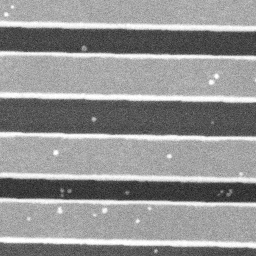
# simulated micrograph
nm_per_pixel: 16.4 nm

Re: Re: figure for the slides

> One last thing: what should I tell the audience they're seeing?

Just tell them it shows lines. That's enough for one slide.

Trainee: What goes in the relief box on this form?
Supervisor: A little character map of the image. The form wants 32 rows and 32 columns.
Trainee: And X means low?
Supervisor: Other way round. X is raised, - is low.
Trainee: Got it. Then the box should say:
XXXXXXXXXXXXXXXXXXXXXXXXXXXXXXXX
XXXXXXXXXXXXXXXXXXXXXXXXXXXXXXXX
XXXXXXXXXXXXXXXXXXXXXXXXXXXXXXXX
----------------------XXXXXXXXXX
--------------------------------
--------------------------------
--------------------------------
XXXXXXXXXXXXXXXXXXXXXXXXXXXXXXXX
XXXXXXXXXXXXXXXXXXXXXXXXXXXXXXXX
XXXXXXXXXXXXXXXXXXXXXXXXXXXXXXXX
XXXXXXXXXXXXXXXXXXXXXXXXXXXXXXXX
XXXXXXXXXXXXXXXXXXXXXXXXXXXXXXXX
-----------------------------XXX
--------------------------------
--------------------------------
--------------------------------
--------------------------------
XXXXXXXXXXXXXXXXXXXXXXXXXXXXXXXX
XXXXXXXXXXXXXXXXXXXXXXXXXXXXXXXX
XXXXXXXXXXXXXXXXXXXXXXXXXXXXXXXX
XXXXXXXXXXXXXXXXXXXXXXXXXXXXXXXX
XXXXXXXXXXXXXXXXXXXXXXXXXXXXXXXX
--------------------------XXXXXX
--------------------------------
--------------------------------
XXXXXXXXXXXXXXXXXXXXXXXXXXXXXXXX
XXXXXXXXXXXXXXXXXXXXXXXXXXXXXXXX
XXXXXXXXXXXXXXXXXXXXXXXXXXXXXXXX
XXXXXXXXXXXXXXXXXXXXXXXXXXXXXXXX
XXXXXXXXXXXXXXXXXXXXXXXXXXXXXXXX
------------------------XXXXXXXX
--------------------------------